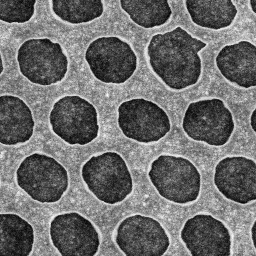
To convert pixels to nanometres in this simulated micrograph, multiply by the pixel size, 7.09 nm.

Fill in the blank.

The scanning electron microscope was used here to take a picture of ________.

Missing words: a regular array of holes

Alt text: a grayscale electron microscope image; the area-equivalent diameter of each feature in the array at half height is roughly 348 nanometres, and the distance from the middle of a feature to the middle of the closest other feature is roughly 65.7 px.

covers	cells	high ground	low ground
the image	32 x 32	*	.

....***......**......**......**.
....***......***.....***......**
....****...******....***.....***
**************************..****
*******************.....********
***....****.....***.......***..*
**......***......*.......**.....
**......***......**......**.....
**......***......**......**.....
***.....****....****.....***....
*****..**************...*****...
********************************
...****....*****..********.*****
....***.....***.....***.....****
....**......***......**......**.
....**......***......**......**.
....***.....***......**......***
...*****....*****...*****....***
********************************
****..******...*****.***********
***.....***.....***.....***.....
**......**......***......**.....
**.......*......***......**.....
***.....***.....****.....**.....
****....****....****.....***....
********************************
********************************
...****....****....*****...*****
....**......***.....***.....***.
....**......**.......**......**.
....***.....***......**......***
....***.....***......***.....***